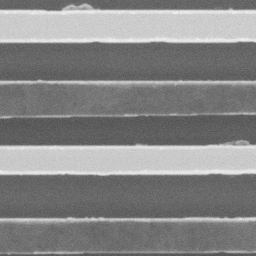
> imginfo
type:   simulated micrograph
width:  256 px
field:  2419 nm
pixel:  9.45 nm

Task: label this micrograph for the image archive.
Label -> lines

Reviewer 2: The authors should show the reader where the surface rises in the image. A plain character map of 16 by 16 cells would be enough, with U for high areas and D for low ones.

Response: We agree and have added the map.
DDDDDDDDDDDDDDDD
UUUUUUUUUUUUUUUU
UUUUUUUUUUUUUUUU
DDDDDDDDDDDDDDDD
DDDDDDDDDDDDDDDD
UUUUUUUUUUUUUUUU
UUUUUUUUUUUUUUUU
DDDDDDDDDDDDDDDD
DDDDDDDDDDDDDDDD
UUUUUUUUUUUUUUUU
UUUUUUUUUUUUUUUU
DDDDDDDDDDDDDDDD
DDDDDDDDDDDDDDDD
DDDDDDDDDDDDDDDD
UUUUUUUUUUUUUUUU
UUUUUUUUUUUUUUUU